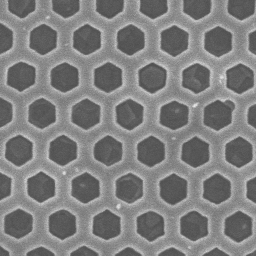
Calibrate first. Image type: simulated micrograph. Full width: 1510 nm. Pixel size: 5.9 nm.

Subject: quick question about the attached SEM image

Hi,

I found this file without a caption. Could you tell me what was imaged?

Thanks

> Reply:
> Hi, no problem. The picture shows a regular array of holes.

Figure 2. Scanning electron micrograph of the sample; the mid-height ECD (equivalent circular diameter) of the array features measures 171 nanometers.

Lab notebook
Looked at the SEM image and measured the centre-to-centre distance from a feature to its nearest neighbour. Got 252 nanometers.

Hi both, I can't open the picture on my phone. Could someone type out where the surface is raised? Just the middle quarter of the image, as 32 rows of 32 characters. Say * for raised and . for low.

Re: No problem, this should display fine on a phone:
..*******....********...*******.
....****......*****......*****..
....****......****........****..
....****.......****.......****..
....****.......****......*****..
...*****......*****......*****..
..*******....*******....*******.
********************************
********************************
****...********...*********..***
**.......****.......*****......*
**.......****.......****.......*
**.......****.......****.......*
**.......****.......****.......*
**.......****.......****.......*
****...*******....*******.....**
****************.***************
********************************
.*********..*********..*********
...*****......*****......*****..
...*****.......***.......*****..
...****........***.......*****..
...****........***.......****...
...*****......****.......****...
..*******....******.....******..
***********.*********.**********
********************************
****..**********.**********.****
***.....******.....******.....**
**.......****.......****.......*
**.......****.......****.......*
**.......****.......****.......*